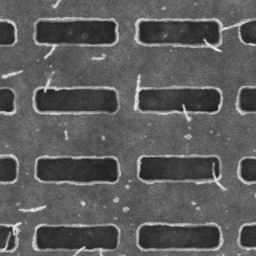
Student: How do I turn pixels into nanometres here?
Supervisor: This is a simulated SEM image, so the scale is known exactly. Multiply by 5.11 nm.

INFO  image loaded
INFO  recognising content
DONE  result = a regular array of holes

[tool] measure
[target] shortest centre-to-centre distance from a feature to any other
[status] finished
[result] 68.3 pixels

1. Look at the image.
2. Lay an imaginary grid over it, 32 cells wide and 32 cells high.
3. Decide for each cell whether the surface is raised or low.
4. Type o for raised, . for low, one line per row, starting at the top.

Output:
oooooooooooooooooooooooooooooooo
oooooooooooooooooooooooooooooooo
ooooo.......o.oooooooooooooooooo
..oo...........oo..........ooo..
..oo...........oo...........oo..
.ooooo........oooo.........ooooo
oooooooooooooooooooooooooooooooo
oooooooooooooooooooooooooooooooo
oooooooooooooooooooooooooooooooo
oooooooooooooooooooooooooooooooo
oooooooooooooooooooooooooooooooo
..ooo..........oo..........ooo..
..oo...........oo...........oo..
..ooo..........oo..........ooo..
oooooooooooooooooooooooooooooooo
oooooooooooooooooooooooooooooooo
oooooooooooooooooooooooooooooooo
oooooooooooooooooooooooooooooooo
oooooooooooooooooooooooooooooooo
oooooooooooooooooooooooo...ooooo
..ooo..........ooo.........ooo..
..oo...........oo..........ooo..
..ooo..........ooo........ooooo.
oooooooooooooooooooooooooooooooo
oooooooooooooooooooooooooooooooo
oooooooooooooooooooooooooooooooo
oooooooooooooooooooooooooooooooo
oooooooooooooooooooooooooooooooo
.oooo.........ooo..........ooo..
..oo...........oo...........oo..
..oo...........oo..........ooo..
oooooooooooooooooooooooooooooooo